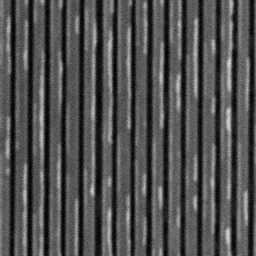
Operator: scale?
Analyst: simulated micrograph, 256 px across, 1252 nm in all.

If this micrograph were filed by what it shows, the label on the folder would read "parallel lines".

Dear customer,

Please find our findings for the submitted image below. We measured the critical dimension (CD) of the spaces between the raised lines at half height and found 30 nm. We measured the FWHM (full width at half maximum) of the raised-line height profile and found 51.4 nanometres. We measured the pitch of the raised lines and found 83.4 nanometers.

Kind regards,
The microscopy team